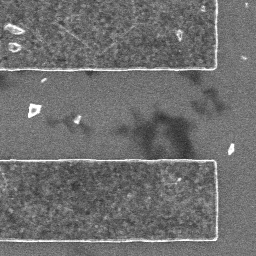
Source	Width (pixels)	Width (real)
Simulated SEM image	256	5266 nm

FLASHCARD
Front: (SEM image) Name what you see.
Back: wiring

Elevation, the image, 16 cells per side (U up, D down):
UUUUUUUUUUUUUUDD
UUUUUUUUUUUUUUDD
UUUUUUUUUUUUUUDD
UUUUUUUUUUUUUUDD
DDDDDDDDDDDDDDDD
DDDDDDDDDDDDDDDD
DDDDDDDDDDDDDDDD
DDDDDDDDDDDDDDDD
DDDDDDDDDDDDDDDD
DDDDDDDDDDDDDDDD
UUUUUUUUUUUUUUDD
UUUUUUUUUUUUUUDD
UUUUUUUUUUUUUUDD
UUUUUUUUUUUUUUDD
UUUUUUUUUUUUUUDD
DDDDDDDDDDDDDDDD